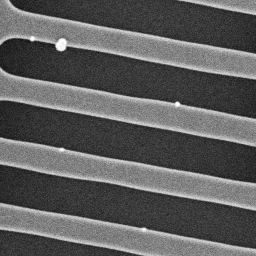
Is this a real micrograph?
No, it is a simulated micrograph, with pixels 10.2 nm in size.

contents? groups of lines, slits or small figures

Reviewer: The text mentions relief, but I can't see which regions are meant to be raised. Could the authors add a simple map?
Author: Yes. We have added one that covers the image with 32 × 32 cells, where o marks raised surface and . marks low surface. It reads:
o........................ooooooo
ooo...........................oo
ooooooooo.......................
oooooooooooooo..................
ooooooooooooooooooo.............
.......oooooooooooooooooo.......
.............oooooooooooooooooo.
..................oooooooooooooo
.......................ooooooooo
oo...........................ooo
oooooooo........................
ooooooooooooo...................
ooooooooooooooooooo.............
......ooooooooooooooooooo.......
............oooooooooooooooooo..
.................ooooooooooooooo
.......................ooooooooo
o...........................oooo
ooooooo.........................
oooooooooooo....................
oooooooooooooooooo..............
.....ooooooooooooooooooo........
...........oooooooooooooooooo...
.................ooooooooooooooo
......................oooooooooo
o...........................oooo
oooooo..........................
oooooooooooo....................
ooooooooooooooooo...............
.....oooooooooooooooooo.........
...........ooooooooooooooooo....
................oooooooooooooooo